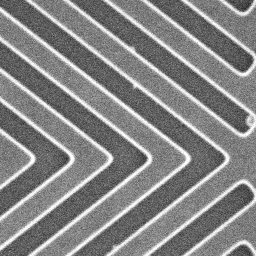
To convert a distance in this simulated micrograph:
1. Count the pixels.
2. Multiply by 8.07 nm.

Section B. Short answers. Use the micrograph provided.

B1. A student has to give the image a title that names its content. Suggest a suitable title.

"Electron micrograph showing groups of lines, slits or small figures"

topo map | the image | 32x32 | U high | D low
DDDDUUUUUDDDDDUUUUUDDDDDUUUUDDDD
UDDDDUUUUUDDDDDUUUUUDDDDDUUUUUDU
UUDDDDDUUUUUDDDDUUUUUDDDDDUUUUUU
UUUDDDDDUUUUUDDDDDUUUUUDDDDUUUUU
UUUUDDDDDUUUUUDDDDDUUUUUDDDDDUUU
DUUUUUDDDDUUUUUDDDDDUUUUUDDDDDUU
DDUUUUUDDDDDUUUUUDDDDUUUUUDDDDDU
DDDUUUUUDDDDDUUUUUDDDDDUUUUUDDDD
DDDDDUUUUUDDDDUUUUUDDDDDUUUUUDDU
UDDDDDUUUUUDDDDDUUUUUDDDDUUUUUUU
UUDDDDDUUUUUDDDDDUUUUUDDDDDUUUUU
UUUUDDDDUUUUUDDDDDUUUUUDDDDDUUUU
UUUUUDDDDDUUUUUDDDDUUUUUDDDDDUUU
DUUUUUDDDDDUUUUUDDDDDUUUUUDDDDUU
DDDUUUUUDDDDUUUUUDDDDDUUUUUDDDDD
DDDDUUUUUDDDDDUUUUUDDDDUUUUUDDDD
DDDDDUUUUUDDDDDUUUUUDDDDDUUUUUDU
UUDDDDUUUUUDDDDDUUUUUDDDDDUUUUUU
UUUDDDDDUUUUUDDDDUUUUUDDDDDUUUUU
UUUUDDDDDUUUUUDDDDDUUUUDDDDDUUUU
UUUUDDDDDUUUUDDDDDUUUUUDDDDDUUUU
UUUDDDDUUUUUDDDDDUUUUUDDDDDUUUUU
UDDDDDUUUUUDDDDDUUUUUDDDDUUUUUUU
DDDDDUUUUUDDDDDUUUUDDDDDUUUUUDDU
DDDDUUUUDDDDDUUUUUDDDDDUUUUUDDDD
DDUUUUUDDDDDUUUUUDDDDDUUUUUDDDDU
DUUUUUDDDDDUUUUUDDDDUUUUUDDDDDUU
UUUUUDDDDDUUUUDDDDDUUUUUDDDDDUUU
UUUDDDDDUUUUUDDDDDUUUUUDDDDDUUUU
UUDDDDDUUUUUDDDDDUUUUDDDDDUUUUUU
UDDDDDUUUUDDDDDUUUUUDDDDDUUUUUDU
DDDDUUUUUDDDDDUUUUUDDDDDUUUUUDDD